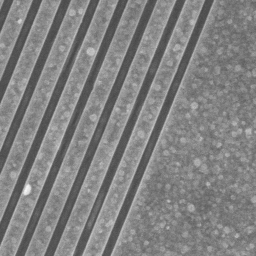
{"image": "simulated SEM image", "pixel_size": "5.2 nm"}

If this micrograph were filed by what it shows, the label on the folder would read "parallel lines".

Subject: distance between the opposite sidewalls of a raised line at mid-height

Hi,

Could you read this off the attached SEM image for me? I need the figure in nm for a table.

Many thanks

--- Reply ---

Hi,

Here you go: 90.3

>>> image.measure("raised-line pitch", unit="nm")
138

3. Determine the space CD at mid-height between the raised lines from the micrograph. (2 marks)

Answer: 49.7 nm